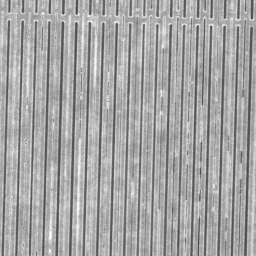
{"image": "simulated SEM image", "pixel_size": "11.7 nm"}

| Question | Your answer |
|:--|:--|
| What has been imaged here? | parallel lines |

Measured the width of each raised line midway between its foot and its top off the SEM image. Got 0.0586 microns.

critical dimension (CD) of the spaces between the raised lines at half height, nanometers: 29.3